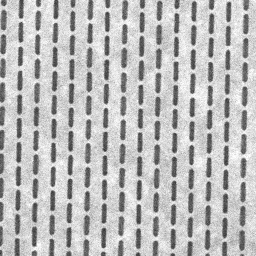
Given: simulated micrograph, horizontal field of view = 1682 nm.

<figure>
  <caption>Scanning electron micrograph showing a regular array of holes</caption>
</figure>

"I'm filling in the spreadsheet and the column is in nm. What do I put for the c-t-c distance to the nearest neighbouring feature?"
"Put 136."